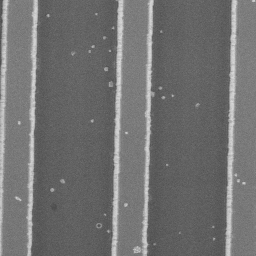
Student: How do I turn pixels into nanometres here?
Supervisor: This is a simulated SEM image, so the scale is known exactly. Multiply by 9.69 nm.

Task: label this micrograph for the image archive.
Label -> lines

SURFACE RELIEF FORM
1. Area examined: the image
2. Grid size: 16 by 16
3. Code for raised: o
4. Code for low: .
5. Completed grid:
oo.....oo......o
oo.....oo......o
oo.....oo......o
oo.....oo......o
oo.....oo.....oo
oo.....oo.....oo
oo.....oo.....oo
oo.....oo.....oo
oo.....oo.....oo
oo.....oo.....oo
oo.....oo.....oo
oo.....oo.....oo
oo.....oo.....oo
oo.....oo.....oo
oo.....oo.....oo
oo.....oo.....oo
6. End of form